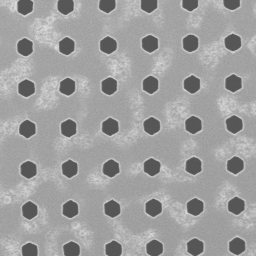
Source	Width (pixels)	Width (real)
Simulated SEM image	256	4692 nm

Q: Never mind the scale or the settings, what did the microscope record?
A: a regular array of holes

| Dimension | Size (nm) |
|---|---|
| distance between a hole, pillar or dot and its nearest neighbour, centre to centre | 745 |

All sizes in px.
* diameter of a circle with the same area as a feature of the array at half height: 17